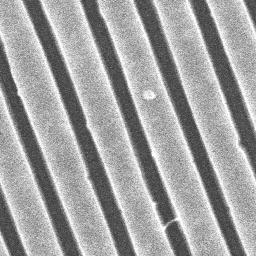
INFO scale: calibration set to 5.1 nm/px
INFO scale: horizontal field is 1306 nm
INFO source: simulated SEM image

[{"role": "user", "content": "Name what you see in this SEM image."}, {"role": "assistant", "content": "parallel lines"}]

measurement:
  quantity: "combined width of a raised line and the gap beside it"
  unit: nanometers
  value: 263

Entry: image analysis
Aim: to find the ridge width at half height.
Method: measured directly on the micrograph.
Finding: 184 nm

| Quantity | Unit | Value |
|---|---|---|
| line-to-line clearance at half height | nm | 80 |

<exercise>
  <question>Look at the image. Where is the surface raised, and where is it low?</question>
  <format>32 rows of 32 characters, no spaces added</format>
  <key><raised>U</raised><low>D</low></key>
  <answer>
UUUDDUUUUUDDUUUUUDDUUUUUDDUUUUUD
UUUDDDUUUUUDDUUUUDDDUUUUDDUUUUUD
UUUUDDUUUUUDDUUUUUDDUUUUUDDUUUUD
UUUUDDUUUUUDDUUUUUDDUUUUUDDUUUUU
UUUUUDDUUUUUDDUUUUDDDUUUUDDDUUUU
UUUUUDDUUUUUDDUUUUUDDUUUUUDDUUUU
DUUUUDDDUUUUDDDUUUUDDUUUUUDDUUUU
DUUUUUDDUUUUUDDUUUUDDDUUUUDDDUUU
DUUUUUDDUUUUUDDUUUUUDDUUUUUDDUUU
DDUUUUUDDUUUUDDDUUUUDDUUUUUDDUUU
DDUUUUUDDUUUUUDDUUUUUDDUUUUDDDUU
DDUUUUUDDDUUUUDDUUUUUDDUUUUUDDUU
UDDUUUUUDDUUUUUDDUUUUDDUUUUUDDDU
UDDUUUUUDDUUUUUDDUUUUUDDUUUUUDDU
UDDUUUUUUDDUUUUDDUUUUUDDUUUUUDDU
UUDDUUUUUDDUUUUUDDUUUUDDUUUUUDDD
UUDDUUUUUDDUUUUUDDUUUUUDDUUUUUDD
UUUDDUUUUUDDUUUUDDUUUUUDDUUUUUDD
UUUDDUUUUUDDUUUUUDDUUUUUDDUUUUDD
UUUDDUUUUUDDUUUUUDDUUUUUDDUUUUUD
UUUUDDUUUUUDDUUUUDDUUUUUDDUUUUUD
UUUUDDUUUUUDDUUUUUDDUUUUUDDUUUUU
UUUUUDUUUUUDDDUUUUDDUUUUUDDUUUUU
UUUUUDDUUUUUDDUUUUDDDUUUUUDDUUUU
UUUUUDDUUUUUDDUUUUUDDUUUUUDDUUUU
DUUUUUDDUUUUDDDUUUUDDUUUUUDDUUUU
DUUUUUDDUUUUUDDUUUUUDDUUUUUDDUUU
DDUUUUDDUUUUUDDUUUUUDDUUUUUDDUUU
DDUUUUUDDUUUUUDDUUUUUDDUUUUDDUUU
DDUUUUUDDUUUUUDDUUUUUDDUUUUUDDUU
UDDUUUUDDDUUUUDDDUUUUDDUUUUUDDUU
UDDUUUUUDDUUUUUDDUUUUUDDUUUUUDDU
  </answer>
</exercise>